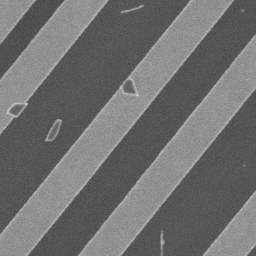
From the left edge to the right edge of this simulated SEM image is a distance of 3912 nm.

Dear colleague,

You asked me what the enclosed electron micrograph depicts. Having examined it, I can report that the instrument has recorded lines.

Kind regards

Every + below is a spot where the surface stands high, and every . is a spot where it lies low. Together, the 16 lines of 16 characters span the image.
++..++......++..
+..+++.....++...
..+++.....+++...
.+++.....+++...+
+++.....+++...++
++.....+++...+++
++.....++...+++.
+.....+++...++..
.....+++...+++..
....+++...+++...
...+++...+++....
...++...+++.....
..+++...++......
.+++...+++.....+
+++...+++.....++
++...+++.....+++